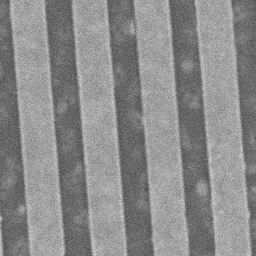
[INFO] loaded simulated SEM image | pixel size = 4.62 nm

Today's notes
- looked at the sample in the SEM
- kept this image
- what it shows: one or a few lines or trenches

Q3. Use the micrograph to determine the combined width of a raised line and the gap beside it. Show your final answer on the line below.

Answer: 285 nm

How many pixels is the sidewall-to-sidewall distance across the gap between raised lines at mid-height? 27.8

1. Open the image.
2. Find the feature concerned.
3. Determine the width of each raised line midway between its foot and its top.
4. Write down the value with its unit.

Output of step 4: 155 nm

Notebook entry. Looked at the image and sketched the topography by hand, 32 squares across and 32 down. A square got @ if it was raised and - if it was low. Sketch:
-@@@@----@@@@----@@@@---@@@@@---
--@@@@---@@@@----@@@@----@@@@---
--@@@@---@@@@----@@@@----@@@@---
--@@@@---@@@@@---@@@@----@@@@---
--@@@@---@@@@@---@@@@----@@@@---
--@@@@----@@@@---@@@@----@@@@---
--@@@@----@@@@---@@@@@---@@@@---
--@@@@----@@@@---@@@@@---@@@@---
--@@@@----@@@@---@@@@@---@@@@---
--@@@@----@@@@----@@@@---@@@@@--
--@@@@----@@@@----@@@@---@@@@@--
--@@@@----@@@@----@@@@---@@@@@--
--@@@@----@@@@----@@@@----@@@@--
--@@@@@---@@@@----@@@@----@@@@--
---@@@@---@@@@----@@@@----@@@@--
---@@@@---@@@@@---@@@@----@@@@--
---@@@@---@@@@@---@@@@----@@@@--
---@@@@----@@@@---@@@@----@@@@--
---@@@@----@@@@---@@@@----@@@@--
---@@@@----@@@@---@@@@@---@@@@--
---@@@@----@@@@---@@@@@---@@@@--
---@@@@----@@@@----@@@@---@@@@@-
---@@@@----@@@@----@@@@---@@@@@-
---@@@@----@@@@----@@@@--@@@@@@-
---@@@@----@@@@----@@@@---@@@@@-
---@@@@@---@@@@----@@@@----@@@@-
---@@@@@---@@@@----@@@@----@@@@-
----@@@@---@@@@----@@@@----@@@@-
----@@@@---@@@@@---@@@@----@@@@-
----@@@@---@@@@@---@@@@----@@@@-
----@@@@----@@@@---@@@@----@@@@-
----@@@@----@@@@---@@@@@---@@@@-